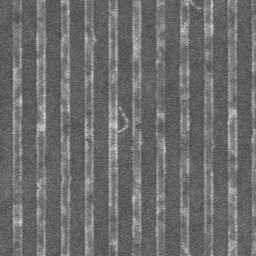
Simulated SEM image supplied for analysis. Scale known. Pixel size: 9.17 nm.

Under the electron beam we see parallel lines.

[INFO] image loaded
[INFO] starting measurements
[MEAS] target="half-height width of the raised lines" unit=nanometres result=73.4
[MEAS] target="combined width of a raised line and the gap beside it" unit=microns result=0.219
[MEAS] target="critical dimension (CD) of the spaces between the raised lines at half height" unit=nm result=147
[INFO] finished